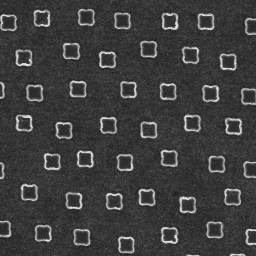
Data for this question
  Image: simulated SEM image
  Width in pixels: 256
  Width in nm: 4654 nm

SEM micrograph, a regular array of raised bodies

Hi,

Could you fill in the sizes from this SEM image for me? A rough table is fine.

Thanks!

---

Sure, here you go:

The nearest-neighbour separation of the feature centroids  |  0.658 µm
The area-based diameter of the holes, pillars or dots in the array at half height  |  310 nm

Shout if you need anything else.